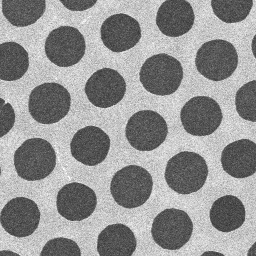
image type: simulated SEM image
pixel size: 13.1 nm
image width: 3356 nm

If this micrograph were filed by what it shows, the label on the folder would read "a regular array of holes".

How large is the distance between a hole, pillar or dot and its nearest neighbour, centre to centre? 747 nanometers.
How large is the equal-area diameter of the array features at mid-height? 545 nanometers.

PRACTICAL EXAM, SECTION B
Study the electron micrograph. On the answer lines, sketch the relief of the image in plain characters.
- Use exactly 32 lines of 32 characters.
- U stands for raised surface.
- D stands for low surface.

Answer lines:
DDDDDDUUDDDDUUUUUUUUDDDDUUDDDDDD
DDDDDDUUUUUUUUUUUUUUDDDDUUUDDDDU
UDDDDUUUUUUUUDDDDUUDDDDDUUUUDDUU
UUUUUUUDDUUUUDDDDDUUDDDDUUUUUUUU
UUUUUUDDDDUUUDDDDDUUUDUUUUUUUUUU
DDUUUUDDDDDUUDDDDUUUUUUUUDDDDUUD
DDDUUUDDDDDUUUDUUUUUUUUUUDDDDDUU
DDDDUUDDDDUUUUUUUUDDDDUUDDDDDDUU
DDDUUUUUUUUUUDUUUUDDDDDUUDDDDDUU
DDDUUUUUUUUDDDDUUDDDDDDUUDDDDUUU
UUUUUDDUUUUDDDDDUUDDDDDUUUUUUUUD
UUUUDDDDDUUDDDDDUUUDDDUUUUUUUUDD
UUUUDDDDDUUDDDDUUUUUUUUUDDDUUDDD
DDUUDDDDDUUUUUUUUUUUUUUDDDDDUDDD
DDUUDDDDUUUUUUUUDDDDUUUDDDDDUUDD
DDUUUUUUUUUUUUUUDDDDDUUDDDDDUUUU
DUUUUUUUUUDDDUUUDDDDDUUDDDDUUUUU
UUUDDDUUUDDDDDUUDDDDDUUUUUUUUUDU
UUDDDDDUUDDDDDUUUDDDUUUUUUUUDDDD
UUDDDDDUUDDDDUUUUUUUUUDDDUUUDDDD
UUDDDDDUUUDDUUUUUUUUUDDDDDUUDDDD
UUDDDDUUUUUUUUUDDDDUUDDDDDUUDDDD
UUUDDUUUUUUUUUDDDDDUUDDDDDUUUUUU
UUUUUUUUDDDUUUDDDDDUUDDDDUUUUUUU
UUUUUUUDDDDDUUDDDDDUUUUUUUUUDUUU
UDDDDUUDDDDDUUUDDDUUUUUUUUUDDDUU
DDDDDUUDDDDDUUUUUUUUDDDUUUDDDDDU
DDDDDUUUUDUUUUUUUUUDDDDDUUDDDDDU
DDDDDUUUUUUUUDDDUUUDDDDDUUUDDDUU
UUDDUUUUUUUUDDDDDUUDDDDDUUUUUUUU
UUUUUUDDDDUUDDDDDUUUDDDUUUUUUUUU
DDUUUDDDDDUUDDDDDUUUUUUUUUDUUUUD